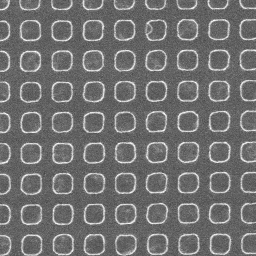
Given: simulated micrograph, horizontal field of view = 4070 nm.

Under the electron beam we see a regular array of raised bodies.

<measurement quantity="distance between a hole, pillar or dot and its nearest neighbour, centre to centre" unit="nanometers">485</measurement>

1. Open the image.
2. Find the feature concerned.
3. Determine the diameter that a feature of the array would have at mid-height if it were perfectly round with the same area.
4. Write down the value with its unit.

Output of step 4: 342 nm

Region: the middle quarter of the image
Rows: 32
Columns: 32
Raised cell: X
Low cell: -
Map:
XX---XXXXX---XXXX----XXXX----XXX
X-----XXX----XXX-----XXX--------
--------------------------------
--------------------------------
----------------X-----XXX-----XX
XX---XXXXX---XXXXX---XXXX----XXX
XX---XXXXX---XXXXX---XXXXX---XXX
XX---XXXXX---XXXXX---XXXX----XXX
XX---XXXXX---XXXX----XXXX----XXX
--------------------------------
--------------------------------
--------------------------------
XX----XXX----XXXX----XXXX----XXX
XX---XXXXX---XXXXX---XXXX----XXX
XX---XXXXX---XXXXX---XXXX----XXX
XX---XXXXX---XXXXX---XXXX----XXX
X----XXXX----XXXX----XXXX----XXX
--------------------------------
--------------------------------
--------------------------------
XX----XXXX---XXXXX---XXXXX---XXX
XX---XXXXX---XXXXX---XXXXX---XXX
XX---XXXXX---XXXXX---XXXXX---XXX
XX---XXXXX---XXXXX---XXXXX---XXX
X-----XX------XXX-----XX------X-
--------------------------------
--------------------------------
X-----XXX-----XXX-----XXX-----XX
XX---XXXXX---XXXXX---XXXXX---XXX
XX---XXXXX---XXXXX---XXXXX---XXX
XX---XXXXX---XXXXX---XXXX----XXX
XX---XXXXX---XXXX----XXXX----XXX